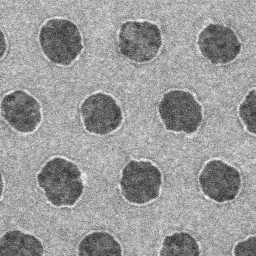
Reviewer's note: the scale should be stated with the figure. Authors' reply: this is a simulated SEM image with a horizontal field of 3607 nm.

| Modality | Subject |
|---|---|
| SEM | a regular array of raised bodies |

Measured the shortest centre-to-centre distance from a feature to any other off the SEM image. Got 1110 nm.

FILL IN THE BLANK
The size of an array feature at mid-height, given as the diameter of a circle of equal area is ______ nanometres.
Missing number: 639